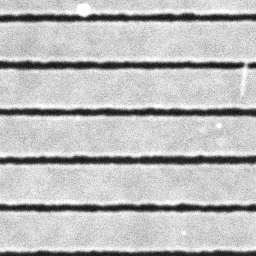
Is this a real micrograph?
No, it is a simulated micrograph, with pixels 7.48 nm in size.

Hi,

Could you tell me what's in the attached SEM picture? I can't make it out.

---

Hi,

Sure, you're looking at lines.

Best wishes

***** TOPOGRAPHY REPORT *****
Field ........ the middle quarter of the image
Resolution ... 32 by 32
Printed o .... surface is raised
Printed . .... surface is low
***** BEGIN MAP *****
................................
ooo..oooo..o.ooooooo..oooooooooo
oooooooooooooooooooooooooooooooo
oooooooooooooooooooooooooooooooo
oooooooooooooooooooooooooooooooo
oooooooooooooooooooooooooooooooo
oooooooooooooooooooooooooooooooo
oooooooooooooooooooooooooooooooo
oooooooooooooooooooooooooooooooo
oooooooooooooooooooooooooooooooo
oooooooooooooooooooooooooooooooo
................................
................................
oooooooooooooooooooooooooooooooo
oooooooooooooooooooooooooooooooo
oooooooooooooooooooooooooooooooo
oooooooooooooooooooooooooooooooo
oooooooooooooooooooooooooooooooo
oooooooooooooooooooooooooooooooo
oooooooooooooooooooooooooooooooo
oooooooooooooooooooooooooooooooo
oooooooooooooooooooooooooooooooo
oooooooooooooooooooooooooooooooo
................................
................................
oooooooooooooooooooooooooooooooo
oooooooooooooooooooooooooooooooo
oooooooooooooooooooooooooooooooo
oooooooooooooooooooooooooooooooo
oooooooooooooooooooooooooooooooo
oooooooooooooooooooooooooooooooo
oooooooooooooooooooooooooooooooo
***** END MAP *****